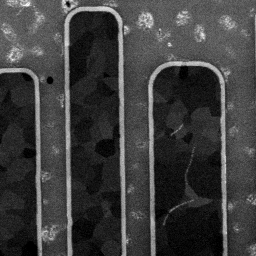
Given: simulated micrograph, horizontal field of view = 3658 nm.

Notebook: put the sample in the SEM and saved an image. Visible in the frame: one or a few lines or trenches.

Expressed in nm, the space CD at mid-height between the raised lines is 420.